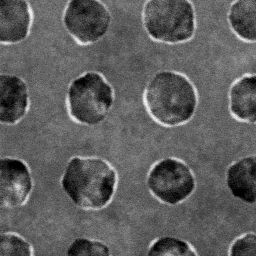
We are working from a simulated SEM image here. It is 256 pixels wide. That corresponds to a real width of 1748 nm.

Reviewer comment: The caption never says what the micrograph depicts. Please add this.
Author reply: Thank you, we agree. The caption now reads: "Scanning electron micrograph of holes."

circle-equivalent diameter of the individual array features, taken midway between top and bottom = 0.344 um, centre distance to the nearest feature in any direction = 0.554 micrometres